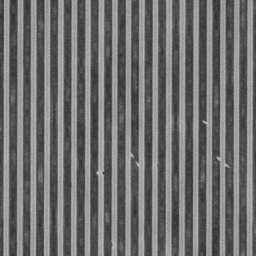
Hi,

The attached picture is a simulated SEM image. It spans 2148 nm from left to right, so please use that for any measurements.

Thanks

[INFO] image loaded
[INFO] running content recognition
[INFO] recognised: parallel lines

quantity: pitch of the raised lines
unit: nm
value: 114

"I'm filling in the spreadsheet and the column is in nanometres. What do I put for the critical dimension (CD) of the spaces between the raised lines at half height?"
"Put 73.5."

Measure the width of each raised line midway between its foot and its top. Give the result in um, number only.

0.0441